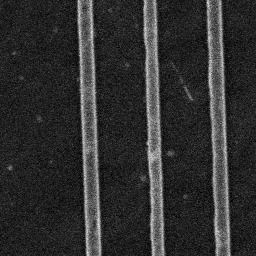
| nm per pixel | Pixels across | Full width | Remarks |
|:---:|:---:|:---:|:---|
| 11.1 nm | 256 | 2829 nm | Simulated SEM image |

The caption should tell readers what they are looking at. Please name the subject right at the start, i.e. one or a few lines or trenches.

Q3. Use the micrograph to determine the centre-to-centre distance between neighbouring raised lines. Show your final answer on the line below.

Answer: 0.714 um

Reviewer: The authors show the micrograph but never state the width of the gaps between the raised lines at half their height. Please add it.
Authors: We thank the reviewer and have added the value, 576 nanometers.